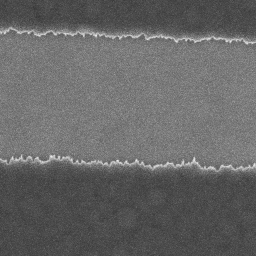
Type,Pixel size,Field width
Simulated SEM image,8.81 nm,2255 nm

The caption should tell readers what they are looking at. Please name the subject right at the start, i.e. one or a few lines or trenches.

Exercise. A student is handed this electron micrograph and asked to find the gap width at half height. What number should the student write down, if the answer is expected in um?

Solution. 1.11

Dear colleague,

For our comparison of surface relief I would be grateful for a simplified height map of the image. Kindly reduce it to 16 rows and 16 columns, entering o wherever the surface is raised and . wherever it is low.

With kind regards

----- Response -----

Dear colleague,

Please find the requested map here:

oooooooooooooooo
oooooooooooooooo
............o.oo
................
................
................
................
................
................
................
ooooooooooooo.oo
oooooooooooooooo
oooooooooooooooo
oooooooooooooooo
oooooooooooooooo
oooooooooooooooo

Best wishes